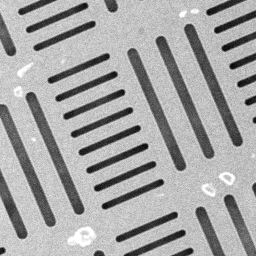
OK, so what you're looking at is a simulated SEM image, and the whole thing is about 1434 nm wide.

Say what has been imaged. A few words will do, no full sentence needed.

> groups of lines, slits or small figures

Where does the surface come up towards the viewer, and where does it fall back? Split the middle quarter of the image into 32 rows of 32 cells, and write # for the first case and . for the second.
###.....#########...#####....###
.....############....#####...###
...########..#####...#####...###
########.....#####...######...##
######.....########...#####...##
###.....###########...#####....#
#.....########.####....#####...#
....#######....#####...#####...#
.########.....######...######...
######.....##########...#####...
####.....############...######..
##....########...#####...#####..
....########.....#####...######.
..########....#########...#####.
#######.....###########...#####.
#####.....#######..####....#####
###.....#######....#####...#####
##...########.....######...#####
##.#######.....##########...####
########.....############...####
######.....#######...####....###
####....########....######...###
####..########....########...###
###########.....###########...##
#########.....#######..####...##
.######.....#######....#####...#
.####....########....#######..##
..####.#######.....#############
..##########.....###############
..########.....#######...#######
...#####....########....########
...#####..########....##########